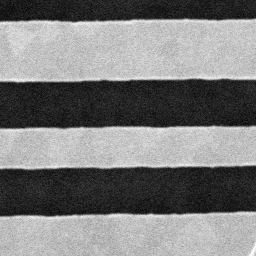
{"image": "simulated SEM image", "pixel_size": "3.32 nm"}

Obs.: lines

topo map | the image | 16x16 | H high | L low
LLLLLLLLLLLLLLLL
HHHHHHHHHHHHHHHH
HHHHHHHHHHHHHHHH
HHHHHHHHHHHHHHHH
HHHHHHHHHHHHHHHH
LLLLLLLLLLLLLLLL
LLLLLLLLLLLLLLLL
LLLLLLLLLLLLLLLL
HHHHHHHHHHHHHHHH
HHHHHHHHHHHHHHHH
LLLLLLLLLLLLLLLL
LLLLLLLLLLLLLLLL
LLLLLLLLLLLLLLLL
LLLLLHHHHHHHHHHH
HHHHHHHHHHHHHHHH
HHHHHHHHHHHHHHHH